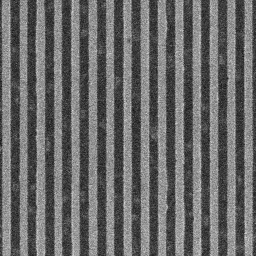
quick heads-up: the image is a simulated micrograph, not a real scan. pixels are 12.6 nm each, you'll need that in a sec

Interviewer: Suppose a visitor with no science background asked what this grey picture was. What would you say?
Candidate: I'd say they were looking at parallel lines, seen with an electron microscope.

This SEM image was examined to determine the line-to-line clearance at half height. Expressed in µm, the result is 0.123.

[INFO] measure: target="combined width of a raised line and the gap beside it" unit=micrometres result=0.218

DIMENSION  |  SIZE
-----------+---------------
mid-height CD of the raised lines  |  0.0897 µm